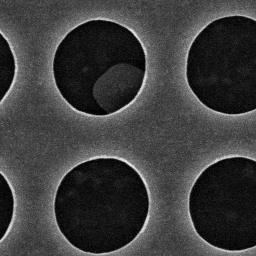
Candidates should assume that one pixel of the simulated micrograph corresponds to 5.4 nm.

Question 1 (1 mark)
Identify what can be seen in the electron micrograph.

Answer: holes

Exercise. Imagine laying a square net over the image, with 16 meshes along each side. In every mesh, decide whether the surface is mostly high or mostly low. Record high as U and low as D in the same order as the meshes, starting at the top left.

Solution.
UUUUUUUUUUUUUUUU
UUUUUDDUUUUUUDDD
UUUUDDDDDUUUDDDD
DUUDDDDDDUUUDDDD
DUUDDDDDDUUUDDDD
DUUUDDDDDUUUDDDD
UUUUDDDDUUUUUDDD
UUUUUUUUUUUUUUUU
UUUUUUUUUUUUUUUU
UUUUUUUUUUUUUUUU
UUUUUDDDUUUUUDDD
DUUUDDDDDUUUDDDD
DUUDDDDDDUUUDDDD
DUUDDDDDDUUUDDDD
UUUUDDDDDUUUDDDD
UUUUUDDDUUUUUUDD